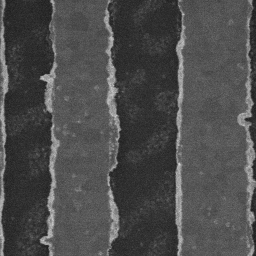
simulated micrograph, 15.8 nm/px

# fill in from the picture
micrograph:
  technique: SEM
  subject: one or a few lines or trenches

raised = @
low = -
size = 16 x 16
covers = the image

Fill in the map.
---@@@@----@@@@@
---@@@@----@@@@@
---@@@@----@@@@@
---@@@@----@@@@@
---@@@@----@@@@@
---@@@@----@@@@@
---@@@@----@@@@@
---@@@@----@@@@-
---@@@@----@@@@@
---@@@@----@@@@@
---@@@@----@@@@@
---@@@@----@@@@@
---@@@@----@@@@@
---@@@@----@@@@@
---@@@@----@@@@@
---@@@@----@@@@@